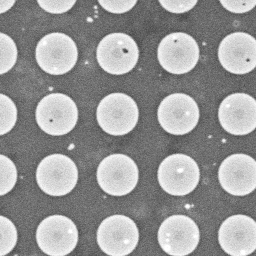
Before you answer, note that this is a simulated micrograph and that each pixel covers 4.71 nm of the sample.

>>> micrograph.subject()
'an array of small figures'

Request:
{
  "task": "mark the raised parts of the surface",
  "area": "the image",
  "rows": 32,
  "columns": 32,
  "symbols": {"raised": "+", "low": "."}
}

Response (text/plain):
++...++++....++++...++++....++++
......++......++.....++......++.
................................
................................
+.....++.....+++.....+++....+++.
++...++++...+++++...+++++...++++
++...+++++..+++++...+++++..+++++
++...+++++..+++++...+++++..+++++
+....++++....++++....+++....++++
................................
................................
................................
+....++++....++++...++++....++++
++...+++++..+++++...+++++..+++++
++...+++++..+++++...+++++..+++++
++...++++...+++++...+++++...++++
+.....++.....+++.....+++.....++.
................................
................................
......++......++.....++......++.
++...++++....++++...+++++...++++
++...+++++..+++++...+++++..+++++
++...+++++..+++++...+++++..+++++
+....++++....++++...++++....++++
................................
................................
................................
+....++++....+++.....+++....++++
++...++++...+++++...+++++...++++
++...+++++..+++++...+++++..+++++
++...++++...+++++...+++++...++++
+.....+++....+++.....+++....+++.